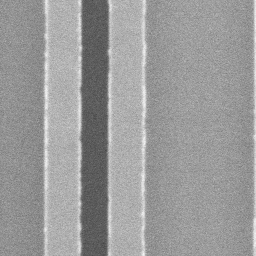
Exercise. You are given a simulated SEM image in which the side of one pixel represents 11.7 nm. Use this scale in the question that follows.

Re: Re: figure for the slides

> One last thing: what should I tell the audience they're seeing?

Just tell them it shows lines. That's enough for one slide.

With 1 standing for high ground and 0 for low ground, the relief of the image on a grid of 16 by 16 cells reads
0001100110000000
0001100110000000
0001100110000000
0001100110000000
0001100110000000
0001100110000000
0001100110000000
0001100110000000
0001100110000000
0001100110000000
0001100110000000
0001100110000000
0001100110000000
0001100110000000
0001100110000000
0001100110000000